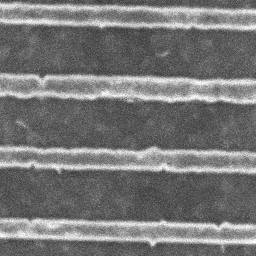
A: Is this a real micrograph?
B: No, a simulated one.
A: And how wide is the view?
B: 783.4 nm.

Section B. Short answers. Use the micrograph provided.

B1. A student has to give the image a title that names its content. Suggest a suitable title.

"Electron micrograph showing one or a few lines or trenches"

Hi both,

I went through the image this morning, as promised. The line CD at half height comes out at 54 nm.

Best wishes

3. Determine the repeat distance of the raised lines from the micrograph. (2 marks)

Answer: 219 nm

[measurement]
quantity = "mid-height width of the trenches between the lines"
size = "165 nm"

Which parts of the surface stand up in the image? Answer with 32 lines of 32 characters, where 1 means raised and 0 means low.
00000000000000000000000000000000
11111111111111111111111111111111
11111111111111111111111111111111
00000000000000000000000000000010
00000000000000000000000000000000
00000000000000000000000000000000
00000000000000000000000000000000
00000000000000000000000000000000
00000000000000000000000000000000
00000000000000000000000000000000
11111111111111111111111111111111
11111111111111111111111111111111
00000000000000000000000000101111
00000000000000000000000000000000
00000000000000000000000000000000
00000000000000000000000000000000
00000000000000000000000000000000
00000000000000000000000000000000
00000000000000000000000000000000
11111111111111111111111111111111
11111111111111111111111111111111
00000000000000000000000000000000
00000000000000000000000000000000
00000000000000000000000000000000
00000000000000000000000000000000
00000000000000000000000000000000
00000000000000000000000000000000
00000000000000000000000000000000
11111111111111111111111111111111
00111111111111111111111111111111
00000000000000000000000000000000
00000000000000000000000000000000